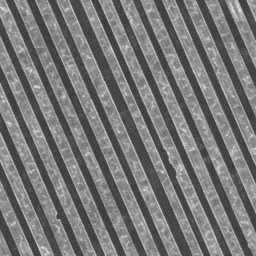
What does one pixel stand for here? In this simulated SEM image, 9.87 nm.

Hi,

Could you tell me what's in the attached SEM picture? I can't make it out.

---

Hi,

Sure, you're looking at parallel lines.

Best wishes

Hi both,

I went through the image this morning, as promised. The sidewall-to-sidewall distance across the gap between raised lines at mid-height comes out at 0.0813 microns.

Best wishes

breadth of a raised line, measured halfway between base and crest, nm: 108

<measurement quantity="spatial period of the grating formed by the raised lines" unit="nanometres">191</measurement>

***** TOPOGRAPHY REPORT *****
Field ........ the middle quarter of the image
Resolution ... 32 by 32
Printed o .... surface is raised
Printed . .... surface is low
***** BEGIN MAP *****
ooo...oo....oo..ooo..ooo...oo...
.oo...ooo...oo..ooo...ooo..ooo..
.ooo..ooo...ooo..ooo..ooo..ooo..
..oo...ooo...oo..ooo...ooo..ooo.
..ooo..ooo...oo...ooo..ooo..ooo.
..ooo...oo....oo..ooo..ooo...ooo
...ooo..ooo...oo...ooo..ooo..ooo
o..ooo...oo....oo..ooo..ooo...oo
o...oo...ooo...oo...oo...ooo..oo
oo..ooo..ooo...ooo..ooo..ooo..oo
oo...oo...ooo...oo..ooo...ooo..o
ooo..ooo..ooo...ooo..ooo..ooo..o
ooo...oo...oo....oo..ooo...oo...
.oo...ooo..ooo...ooo..ooo..ooo..
.ooo..ooo...oo....oo..ooo..ooo..
.ooo...ooo..ooo...ooo..ooo..ooo.
..ooo..ooo...oo....oo..ooo..ooo.
..ooo...ooo..ooo...oo..ooo...ooo
...ooo..ooo..ooo...ooo..ooo..ooo
o..ooo...ooo..ooo...oo..ooo...oo
o...ooo..ooo..ooo...ooo..ooo..oo
oo..ooo...oo...ooo...oo..ooo...o
oo..ooo...ooo..ooo...ooo..ooo..o
ooo..ooo..ooo...ooo...oo..ooo..o
ooo..ooo...ooo..ooo...ooo..oo...
.oo...ooo..ooo...oo....oo..ooo..
.ooo..ooo...ooo..ooo...oo...oo..
.ooo...ooo..ooo..ooo...ooo..ooo.
..ooo..ooo...ooo..ooo...oo..ooo.
..ooo...oo...ooo..ooo...ooo..ooo
...ooo..ooo..ooo...ooo...oo..ooo
o..ooo..ooo...ooo..ooo...ooo..oo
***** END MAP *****